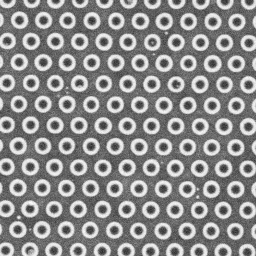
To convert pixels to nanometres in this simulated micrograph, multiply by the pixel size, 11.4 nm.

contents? an array of small figures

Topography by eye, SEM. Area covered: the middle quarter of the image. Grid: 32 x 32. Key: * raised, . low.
***..****..****..****..****..***
**....**....**....**....**....**
................................
..***....**....**....**....**...
..****..****..****..****..****..
..****..****..****..****..****..
...**....**....**...***....**...
................................
**....**....**....**....**....**
***..****..****..****..****..***
***..****..****..****..****..***
**...***...***...****..****..***
................................
...*.....**.....................
..****..****..****..****..****..
..****..****..****..****..****..
..***...****..****..****..****..
...............*...........*....
................................
**...***...****..***...***...***
***..****..****..****..****..***
**...****..****..****..****..***
......*.....**....**....**....**
................................
..***...***...***...***....**...
..****..****..****..****..****..
..****..****..****..****..****..
...**...***...***...***...***...
................................
**...***....**...***....**....**
***..****..****..****..****..***
***..****..****..****..****..***